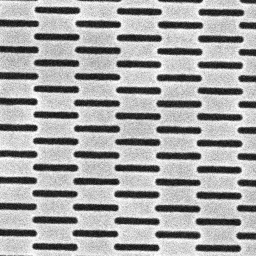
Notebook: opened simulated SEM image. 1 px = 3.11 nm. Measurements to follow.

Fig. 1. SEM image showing a regular array of holes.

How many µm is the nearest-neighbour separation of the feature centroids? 0.0808